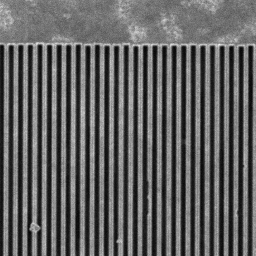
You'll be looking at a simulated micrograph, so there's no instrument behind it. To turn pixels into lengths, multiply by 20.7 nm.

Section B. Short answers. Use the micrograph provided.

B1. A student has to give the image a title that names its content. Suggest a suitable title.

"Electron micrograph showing parallel lines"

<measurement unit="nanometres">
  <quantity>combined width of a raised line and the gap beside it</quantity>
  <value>198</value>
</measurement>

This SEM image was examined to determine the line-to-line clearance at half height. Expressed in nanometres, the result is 111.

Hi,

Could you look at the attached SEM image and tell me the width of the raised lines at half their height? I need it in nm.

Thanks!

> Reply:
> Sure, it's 90.5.